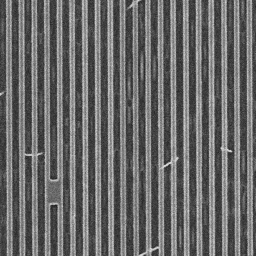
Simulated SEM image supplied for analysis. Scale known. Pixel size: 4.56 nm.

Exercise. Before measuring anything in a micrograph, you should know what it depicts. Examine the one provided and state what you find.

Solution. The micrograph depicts parallel lines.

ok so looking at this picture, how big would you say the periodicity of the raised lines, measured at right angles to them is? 57.7 nm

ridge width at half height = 3.99 pixels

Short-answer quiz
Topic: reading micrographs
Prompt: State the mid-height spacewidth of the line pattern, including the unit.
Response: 39.9 nanometers